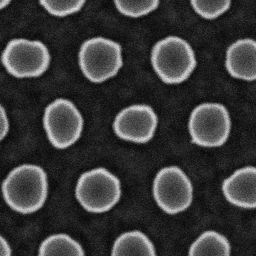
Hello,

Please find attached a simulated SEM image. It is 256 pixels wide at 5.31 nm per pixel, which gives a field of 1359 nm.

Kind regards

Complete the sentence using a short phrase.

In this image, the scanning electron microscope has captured a regular array of raised bodies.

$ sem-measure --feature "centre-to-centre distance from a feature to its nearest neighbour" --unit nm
388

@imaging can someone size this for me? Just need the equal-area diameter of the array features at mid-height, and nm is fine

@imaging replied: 216